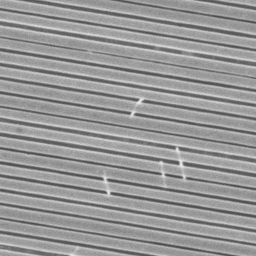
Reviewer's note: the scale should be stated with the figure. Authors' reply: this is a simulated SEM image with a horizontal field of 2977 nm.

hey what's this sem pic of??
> parallel lines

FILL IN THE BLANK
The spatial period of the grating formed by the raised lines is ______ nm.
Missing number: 160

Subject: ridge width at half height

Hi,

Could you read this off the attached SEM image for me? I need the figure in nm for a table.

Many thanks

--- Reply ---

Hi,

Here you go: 113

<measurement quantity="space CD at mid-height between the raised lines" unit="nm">46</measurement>